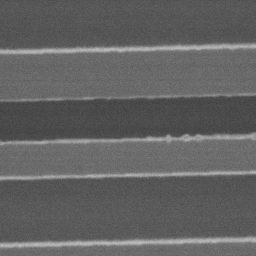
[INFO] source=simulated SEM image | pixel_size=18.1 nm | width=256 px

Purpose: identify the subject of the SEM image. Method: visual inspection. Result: lines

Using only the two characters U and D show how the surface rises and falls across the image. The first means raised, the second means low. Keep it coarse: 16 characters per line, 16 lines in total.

DDDDDDDDDDDDDDDD
DDDDDDDDDDDDDDDD
DDDDDDDDDDDDDDDD
UUUUUUUUUUUUUUUU
UUUUUUUUUUUUUUUU
UUUUUUUUUUUUUUUU
DDDDDDDDDDDDDDDD
DDDDDDDDDDDDDDDD
DDDDDDDDDDDDDDDU
UUUUUUUUUUUUUUUU
UUUUUUUUUUUUUUUU
DDDDDDDDDDDDDDDD
DDDDDDDDDDDDDDDD
DDDDDDDDDDDDDDDD
DDDDDDDDDDDDDDDD
UUUUUUUUUUUUUUUU